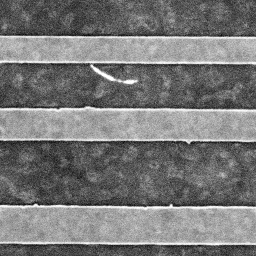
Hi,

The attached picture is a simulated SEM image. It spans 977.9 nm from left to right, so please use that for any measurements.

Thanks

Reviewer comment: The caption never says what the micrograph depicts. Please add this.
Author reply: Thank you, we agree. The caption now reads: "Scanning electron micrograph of one or a few lines or trenches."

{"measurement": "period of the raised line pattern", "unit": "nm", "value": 335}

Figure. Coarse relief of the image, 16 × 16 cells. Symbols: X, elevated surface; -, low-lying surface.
----------------
----------------
XXXXXXXXXXXXXXXX
XXXXXXXXXXXXXXXX
----------------
----------------
----------------
XXXXXXXXXXXXXXXX
XXXXXXXXXXXXXXXX
----------------
----------------
----------------
----------------
XXXXXXXXXXXXXXXX
XXXXXXXXXXXXXXXX
----------------